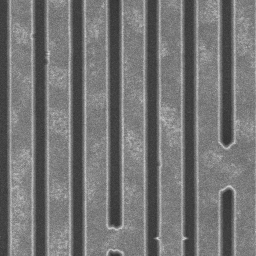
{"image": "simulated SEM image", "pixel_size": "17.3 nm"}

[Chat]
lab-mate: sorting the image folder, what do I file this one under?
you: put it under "parallel lines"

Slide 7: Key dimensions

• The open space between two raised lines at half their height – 0.217 microns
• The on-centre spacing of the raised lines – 647 nm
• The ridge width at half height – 418 nanometers